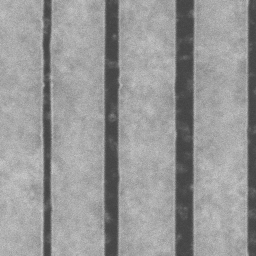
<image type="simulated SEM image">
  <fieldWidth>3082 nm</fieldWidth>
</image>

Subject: one or a few lines or trenches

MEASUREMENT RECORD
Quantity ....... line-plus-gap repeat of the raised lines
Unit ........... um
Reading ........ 0.828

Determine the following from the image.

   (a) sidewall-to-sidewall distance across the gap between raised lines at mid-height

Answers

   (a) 616 nm